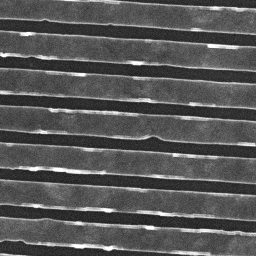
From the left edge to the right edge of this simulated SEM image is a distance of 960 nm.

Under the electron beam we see parallel lines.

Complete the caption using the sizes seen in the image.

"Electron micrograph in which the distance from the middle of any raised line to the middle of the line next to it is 139 nm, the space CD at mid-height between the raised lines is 43.5 nm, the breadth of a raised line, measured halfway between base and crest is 93.9 nanometers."